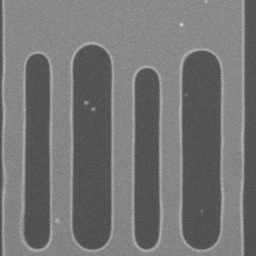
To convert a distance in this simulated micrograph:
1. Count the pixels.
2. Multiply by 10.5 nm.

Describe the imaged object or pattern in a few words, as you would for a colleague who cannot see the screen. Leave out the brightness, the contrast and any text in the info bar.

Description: groups of lines, slits or small figures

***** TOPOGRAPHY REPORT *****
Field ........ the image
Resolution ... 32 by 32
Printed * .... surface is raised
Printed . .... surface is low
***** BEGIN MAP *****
******************************..
******************************..
******************************..
******************************..
******************************..
***********.******************..
**********...***********..****..
.**...***.....*********....***..
.**...***.....****.****.....**..
***...***.....***...***.....**..
***...***.....***...***.....**..
***...***.....***...***.....**..
***...***.....***...***.....**..
***...***.....***...***.....**..
.**...***.....***...***.....**..
***...***.....***...***.....**..
***...***.....***...***.....**..
***...***.....***...***.....**..
***...***.....***...***.....**..
***...***.....***...***.....**..
***...***.....***...***.....**..
.**...***.....***...***.....**..
.**...***.....***...***.....**..
.**...***.....***...***.....**..
***...***.....***...***.....**..
***...***.....***...***.....**..
***...***.....***...***.....**..
***...***.....***...***.....**..
***...***.....***...***.....**..
***...***.....***...***....***..
***...****...****...***....***..
******************************..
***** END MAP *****